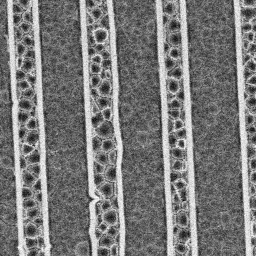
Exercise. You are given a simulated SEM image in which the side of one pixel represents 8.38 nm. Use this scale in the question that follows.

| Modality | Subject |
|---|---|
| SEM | one or a few lines or trenches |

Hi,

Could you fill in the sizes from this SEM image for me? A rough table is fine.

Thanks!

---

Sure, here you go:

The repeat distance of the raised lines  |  621 nanometres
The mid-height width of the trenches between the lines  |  395 nm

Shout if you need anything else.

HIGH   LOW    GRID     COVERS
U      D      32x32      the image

DUUUDDDDDDUUUUDDDDDDUUUDDDDDDDUU
DUUUDDDDDDUUUUDDDDDDUUUDDDDDDDUU
DUUUUDDDDDUUUUDDDDDDUUUDDDDDDDUU
DUUUUDDDDDUUUUDDDDDDUUUDDDDDDDUU
DUUUUDDDDDUUUUDDDDDDUUUDDDDDDDUU
DUUUUDDDDDDUUUDDDDDDUUUDDDDDDDUU
DUUUUDDDDDDUUUDDDDDDUUUDDDDDDDUU
DDUUUDDDDDDUUUDDDDDDUUUDDDDDDDUU
DDUUUDDDDDDUUUDDDDDDUUUDDDDDDDUU
DDUUUDDDDDDUUUDDDDDDUUUDDDDDDDUU
DDUUUDDDDDDUUUDDDDDDUUUDDDDDDDUU
DDUUUDDDDDDUUUDDDDDDUUUDDDDDDDUU
DDUUUDDDDDDUUUDDDDDDUUUDDDDDDDUU
DDUUUDDDDDDUUUUDDDDDDUUUDDDDDDUU
DDUUUDDDDDDUUUUDDDDDDUUUDDDDDDUU
DDUUUDDDDDDUUUUDDDDDDUUUDDDDDDUU
DDUUUDDDDDDUUUUDDDDDDUUUDDDDDDUU
DDUUUDDDDDDUUUUDDDDDDUUUDDDDDDUU
DDUUUDDDDDDUUUUDDDDDDUUUDDDDDDUU
DDUUUDDDDDDUUUUDDDDDDUUUDDDDDDUU
DDUUUDDDDDDUUUUDDDDDDUUUDDDDDDDU
DDUUUDDDDDDUUUUDDDDDDUUUDDDDDDDU
DDUUUDDDDDDUUUUDDDDDDUUUDDDDDDDU
DDUUUUDDDDDUUUUDDDDDDUUUDDDDDDDU
DDUUUUDDDDDDUUUDDDDDDUUUDDDDDDDU
DDUUUUDDDDDDUUUDDDDDDUUUDDDDDDDU
DDUUUUDDDDDDUUUDDDDDDUUUDDDDDDDU
DDUUUUDDDDDDUUUDDDDDDUUUDDDDDDDU
DDDUUUDDDDDUUUUDDDDDDUUUDDDDDDDU
DDDUUUDDDDDDUUUDDDDDDUUUDDDDDDDU
DDDUUUDDDDDDUUUDDDDDDUUUDDDDDDDU
DDDUUUDDDDDDUUUDDDDDDUUUDDDDDDDU